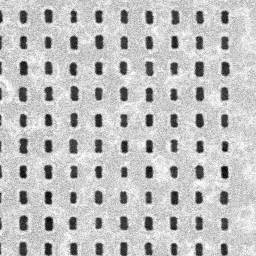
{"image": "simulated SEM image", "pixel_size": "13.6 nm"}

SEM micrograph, a regular array of holes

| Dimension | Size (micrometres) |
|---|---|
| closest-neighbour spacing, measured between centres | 0.338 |